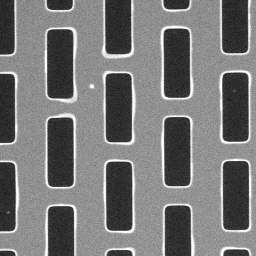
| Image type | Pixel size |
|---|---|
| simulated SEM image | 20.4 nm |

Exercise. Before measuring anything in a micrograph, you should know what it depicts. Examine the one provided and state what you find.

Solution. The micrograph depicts groups of lines, slits or small figures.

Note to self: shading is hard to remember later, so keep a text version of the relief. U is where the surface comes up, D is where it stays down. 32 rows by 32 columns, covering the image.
DDUUUUDDDUUUUDDDDUUUDDDDUUUUDDDU
DDUUUUUUUUUUUDDDDUUUUUUUUUUUDDDU
DDUUUUUUUUUUUDDDDUUUUUUUUUUUDDDU
DDUUUUUUUUUUUDDDDUUUUDDUUUUUDDDU
DDUUUUDDDUUUUDDDDUUUDDDDUUUUDDDU
DDUUUUDDDUUUUDDDDUUUDDDDUUUUDDDU
DDUUUUDDDUUUUDDDUUUUDDDDUUUUDDDU
UUUUUUDDDUUUUUUUUUUUDDDDUUUUUUUU
UUUUUUDDDUUUUUUUUUUUDDDDUUUUUUUU
DDUUUUDDDUUUUDDDUUUUDDDDUUUUDDDU
DDUUUUDDDUUUUDDDDUUUDDDDUUUUDDDU
DDUUUUDDDUUUUDDDDUUUDDDDUUUUDDDU
DDUUUUUUDUUUUDDDDUUUUUUUUUUUDDDU
DDUUUUUUUUUUUDDDDUUUUUUUUUUUDDDU
DDUUUUUUDUUUUDDDDUUUUUDUUUUUDDDU
DDUUUUDDDUUUUDDDDUUUDDDDUUUUDDDU
DDUUUUDDDUUUUDDDDUUUDDDDUUUUDDDU
DDUUUUDDDUUUUDDDUUUUDDDDUUUUDDDU
UUUUUUDDDUUUUUUUUUUUDDDDUUUUUUUU
UUUUUUDDDUUUUUUUUUUUDDDDUUUUUUUU
DDUUUUDDDUUUUDDDUUUUDDDDUUUUDDDU
DDUUUUDDDUUUUDDDDUUUDDDDUUUUDDDU
DDUUUUDDDUUUUDDDDUUUDDDDUUUUDDDU
DDUUUUUUUUUUUDDDDUUUUUUUUUUUDDDU
DDUUUUUUUUUUUDDDDUUUUUUUUUUUDDDU
DDUUUUUUUUUUUDDDDUUUUUUUUUUUDDDU
DDUUUUDDDUUUUDDDDUUUDDDDUUUUDDDU
DDUUUUDDDUUUUDDDDUUUDDDDUUUUDDDU
DDUUUUDDDUUUUDDDDUUUDDDDUUUUDDDU
UUUUUUDDDUUUUUUUUUUUDDDDUUUUUUUU
UUUUUUDDDUUUUUUUUUUUDDDDUUUUUUUU
DDUUUUDDDUUUUUDDUUUUDDDDUUUUDDDU